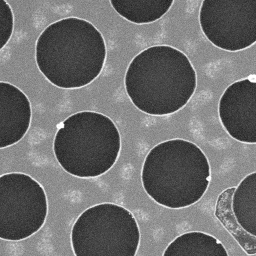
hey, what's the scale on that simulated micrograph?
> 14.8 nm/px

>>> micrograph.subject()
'holes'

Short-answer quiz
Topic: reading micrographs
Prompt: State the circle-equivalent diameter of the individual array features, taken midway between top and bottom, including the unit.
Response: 69 pixels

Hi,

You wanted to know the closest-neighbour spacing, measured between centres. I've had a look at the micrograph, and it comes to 1380 nm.